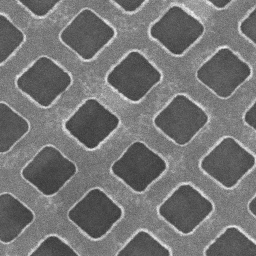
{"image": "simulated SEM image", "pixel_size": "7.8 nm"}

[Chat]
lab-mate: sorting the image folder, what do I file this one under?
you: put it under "a regular array of holes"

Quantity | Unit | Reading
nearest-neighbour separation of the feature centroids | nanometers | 492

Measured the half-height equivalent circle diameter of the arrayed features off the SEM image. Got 360 nm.